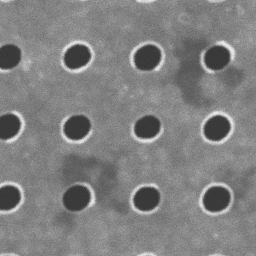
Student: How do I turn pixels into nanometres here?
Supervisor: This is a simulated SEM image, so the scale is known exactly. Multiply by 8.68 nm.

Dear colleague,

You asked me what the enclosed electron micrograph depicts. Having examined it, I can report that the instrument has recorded a regular array of holes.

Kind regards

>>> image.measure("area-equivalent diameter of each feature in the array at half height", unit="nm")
233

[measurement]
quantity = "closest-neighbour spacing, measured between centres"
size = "69.9 px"